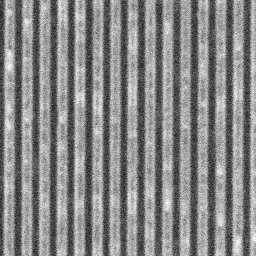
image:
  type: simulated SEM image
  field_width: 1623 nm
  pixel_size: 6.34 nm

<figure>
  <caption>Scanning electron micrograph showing parallel lines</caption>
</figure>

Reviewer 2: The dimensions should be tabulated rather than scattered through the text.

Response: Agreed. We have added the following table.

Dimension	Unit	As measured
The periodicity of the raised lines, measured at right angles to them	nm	112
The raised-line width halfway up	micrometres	0.0555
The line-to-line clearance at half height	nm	56.3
